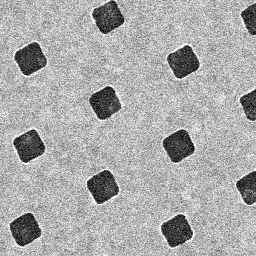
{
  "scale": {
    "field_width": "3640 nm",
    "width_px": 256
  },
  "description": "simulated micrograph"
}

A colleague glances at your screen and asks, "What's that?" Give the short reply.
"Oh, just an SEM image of a regular array of holes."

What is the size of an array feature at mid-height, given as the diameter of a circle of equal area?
440 nm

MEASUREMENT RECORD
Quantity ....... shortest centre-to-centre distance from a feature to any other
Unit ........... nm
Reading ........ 1190